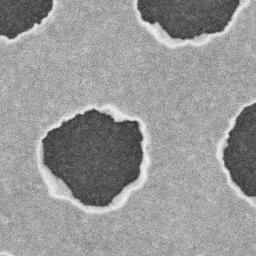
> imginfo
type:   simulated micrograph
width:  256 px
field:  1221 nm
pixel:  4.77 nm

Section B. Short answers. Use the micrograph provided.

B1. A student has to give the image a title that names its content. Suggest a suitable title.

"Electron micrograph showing holes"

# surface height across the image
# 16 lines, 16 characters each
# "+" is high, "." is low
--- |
...++++++......+
..+++++++.....++
+++++++++++..+++
++++++++++++++++
++++++++++++++++
++++++++++++++++
++++++++++++++++
++++....+++++++.
+++......+++++..
+++......+++++..
+++......+++++..
++++....+++++++.
+++++..+++++++++
++++++++++++++++
++++++++++++++++
++++++++++++++++